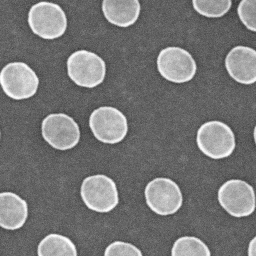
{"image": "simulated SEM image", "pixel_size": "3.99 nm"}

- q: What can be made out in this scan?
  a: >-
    a regular array of raised bodies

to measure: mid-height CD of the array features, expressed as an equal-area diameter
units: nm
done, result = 143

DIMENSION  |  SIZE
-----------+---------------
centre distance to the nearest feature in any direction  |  248 nm